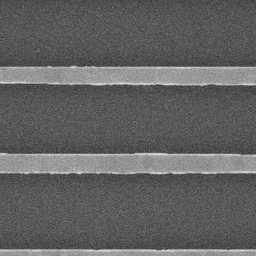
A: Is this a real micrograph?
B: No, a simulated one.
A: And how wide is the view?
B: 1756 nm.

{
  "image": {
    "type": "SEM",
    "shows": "lines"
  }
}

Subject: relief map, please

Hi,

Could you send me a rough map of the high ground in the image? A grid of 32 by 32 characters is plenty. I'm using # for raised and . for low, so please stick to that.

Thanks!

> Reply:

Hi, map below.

................................
................................
................................
................................
................................
................................
................................
................................
################################
################################
............#.......######.#####
................................
................................
................................
................................
................................
................................
................................
................................
################################
################################
################################
................................
................................
................................
................................
................................
................................
................................
................................
................................
################################